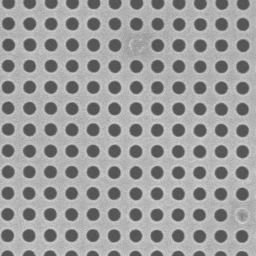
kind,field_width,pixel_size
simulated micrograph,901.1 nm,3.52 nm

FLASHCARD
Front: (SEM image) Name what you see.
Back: a regular array of holes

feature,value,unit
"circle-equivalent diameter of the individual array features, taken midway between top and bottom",45.5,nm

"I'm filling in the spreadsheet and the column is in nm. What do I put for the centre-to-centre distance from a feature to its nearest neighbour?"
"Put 74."